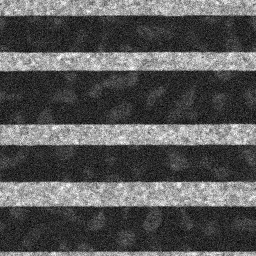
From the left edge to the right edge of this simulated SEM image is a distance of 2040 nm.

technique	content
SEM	one or a few lines or trenches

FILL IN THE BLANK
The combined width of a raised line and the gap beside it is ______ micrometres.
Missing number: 0.521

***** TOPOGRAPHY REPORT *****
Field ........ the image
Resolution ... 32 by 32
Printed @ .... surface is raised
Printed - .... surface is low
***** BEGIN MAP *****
@@@@@@@@@@@@@@@@@@@@@@@@@@@@@@@@
@@@@@@@@@@@@@@@@@@@@@@@@@@@@@@@@
--------------------------------
--------------------------------
--------------------------------
--------------------------------
--------------------------------
@@@@@@@@@@@@@@@@@@@@@@@@@@@@@@@@
@@@@@@@@@@@@@@@@@@@@@@@@@@@@@@@@
--------------------------------
--------------------------------
--------------------------------
--------------------------------
--------------------------------
--------------------------------
--------------------------------
@@@@@@@@@@@@@@@@@@@@@@@@@@@@@@@@
@@@@@@@@@@@@@@@@@@@@@@@@@@@@@@@@
--------------------------------
--------------------------------
--------------------------------
--------------------------------
--------------------------------
@@@@@@@@@@@@@@@@@@@@@@@@@@@@@@@@
@@@@@@@@@@@@@@@@@@@@@@@@@@@@@@@@
@@@@@@@@@@@@@@@@@@@-@@@@@@@@@@@@
--------------------------------
--------------------------------
--------------------------------
--------------------------------
--------------------------------
-------@------------------------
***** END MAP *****